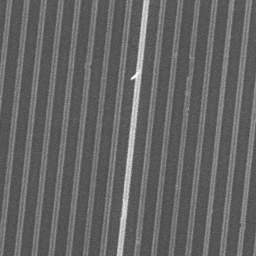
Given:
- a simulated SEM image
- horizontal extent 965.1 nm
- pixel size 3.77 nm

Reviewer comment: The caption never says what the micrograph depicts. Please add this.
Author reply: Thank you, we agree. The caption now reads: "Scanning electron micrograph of parallel lines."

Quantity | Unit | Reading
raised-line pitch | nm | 64.2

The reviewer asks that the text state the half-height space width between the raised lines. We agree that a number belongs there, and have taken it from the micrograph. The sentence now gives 49.7 nm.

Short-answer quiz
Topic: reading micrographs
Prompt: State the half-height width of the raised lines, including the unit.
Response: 0.0141 um